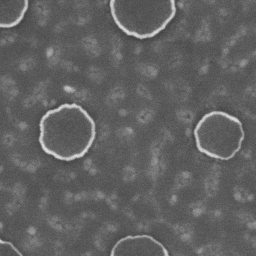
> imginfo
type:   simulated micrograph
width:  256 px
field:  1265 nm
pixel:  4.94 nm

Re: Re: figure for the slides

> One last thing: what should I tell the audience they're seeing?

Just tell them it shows raised bodies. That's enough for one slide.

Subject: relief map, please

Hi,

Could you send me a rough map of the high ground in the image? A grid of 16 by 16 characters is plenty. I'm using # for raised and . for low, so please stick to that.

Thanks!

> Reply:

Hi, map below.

##.....####.....
#......###......
................
................
................
................
................
...###.......##.
...###......###.
...##........##.
................
................
................
................
................
#......###......